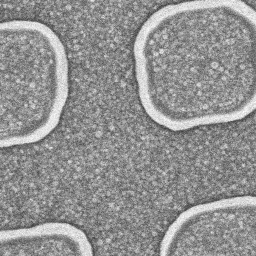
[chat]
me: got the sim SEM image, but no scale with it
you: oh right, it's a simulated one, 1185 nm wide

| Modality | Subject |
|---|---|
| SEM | raised bodies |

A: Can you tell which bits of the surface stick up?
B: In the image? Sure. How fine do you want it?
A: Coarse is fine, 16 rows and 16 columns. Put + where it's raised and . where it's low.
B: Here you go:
...........++++.
..........++++++
+++......+++++++
++++.....+++++++
++++.....+++++++
++++.....+++++++
++++.....+++++++
+++.......+++...
++..............
................
................
................
................
............++++
..++.......+++++
+++++.....++++++